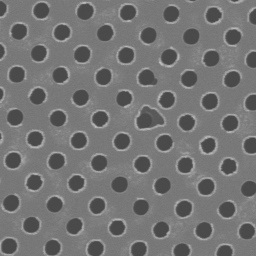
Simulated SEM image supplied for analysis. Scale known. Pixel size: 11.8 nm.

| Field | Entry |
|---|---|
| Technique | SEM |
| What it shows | a regular array of holes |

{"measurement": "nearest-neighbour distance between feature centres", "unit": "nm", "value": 350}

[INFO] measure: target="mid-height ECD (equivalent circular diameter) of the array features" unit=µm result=0.19